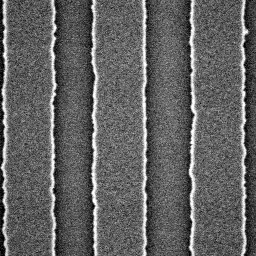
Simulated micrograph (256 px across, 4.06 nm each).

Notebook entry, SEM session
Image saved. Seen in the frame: lines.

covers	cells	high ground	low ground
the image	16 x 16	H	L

HHHLLLHHHLLLHHHL
HHHLLLHHHLLLHHHL
HHHLLLHHHLLLHHHL
HHHLLLHHHLLLHHHL
HHHLLLHHHLLLHHHL
HHHLLLHHHLLLHHHL
HHHLLLHHHLLLHHHL
HHHLLLHHHLLLHHHL
HHHLLLHHHLLLHHHL
HHHLLLHHHLLLHHHL
HHHLLLHHHLLLHHHL
HHHLLLHHHLLLHHHL
HHHLLLHHHLLLHHHL
HHHLLLHHHLLLHHHL
HHHLLLHHHLLLHHHL
HHHLLLHHHLLLHHHL